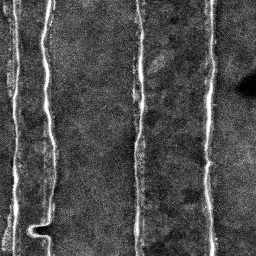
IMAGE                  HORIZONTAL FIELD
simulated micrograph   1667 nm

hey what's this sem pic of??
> one or a few lines or trenches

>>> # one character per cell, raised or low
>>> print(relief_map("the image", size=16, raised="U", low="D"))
DUUDDDDDDUUUUDDD
DUUDDDDDDUUUUDDD
DUUDDDDDDUUUUDDD
DUUDDDDDDUUUUDDD
DUUDDDDDDUUUUDDD
DUUDDDDDDUUUUDDD
DUUDDDDDDUUUUDDD
DUUDDDDDDUUUUDDD
DUUDDDDDDUUUUDDD
DUUDDDDDUUUUUDDD
DUUDDDDDUUUUUDDD
DUUDDDDDDUUUUDDD
DUUDDDDDDUUUUDDD
DUUDDDDDDUUUUDDD
DUDDDDDDDUUUUDDD
DUUDDDDDDUUUUDDD